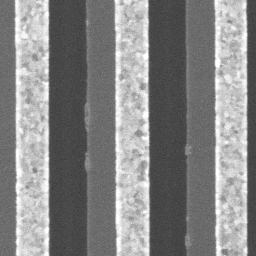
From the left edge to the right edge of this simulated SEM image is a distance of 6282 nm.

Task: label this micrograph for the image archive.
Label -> lines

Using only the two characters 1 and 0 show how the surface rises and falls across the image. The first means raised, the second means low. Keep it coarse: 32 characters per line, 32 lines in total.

11111100000111111100000111111110
11111100000111111100000111111110
11111100000111111100000111111110
11111100000111111100000111111110
11111100000111111100000111111110
11111100000111111100000111111110
11111100000111111100000111111110
11111100000111111100000111111110
11111100000111111100000111111110
11111100000111111100000111111110
11111100000111111100000111111110
11111100000111111100000111111110
11111100000111111100000111111110
11111100000111111100000111111110
11111100000111111100000111111110
11111100000111111110000111111110
11111100000111111110000111111110
11111100000111111110000111111110
11111100000111111110000111111110
11111100000111111110000111111110
11111100000111111110000111111110
11111100000111111110000111111110
11111100000111111110000111111110
11111100000111111110000111111110
11111100000111111110000111111110
11111100000111111110000111111110
11111100000111111110000111111110
11111100000111111110000111111110
11111100000111111110000111111110
11111100000111111110000111111110
11111100000111111110000111111110
11111100000111111110000111111110